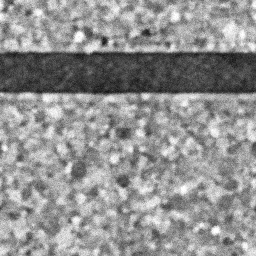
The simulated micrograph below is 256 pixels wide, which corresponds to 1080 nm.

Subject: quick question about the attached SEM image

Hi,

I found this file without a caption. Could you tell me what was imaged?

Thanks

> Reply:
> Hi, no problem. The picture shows one or a few lines or trenches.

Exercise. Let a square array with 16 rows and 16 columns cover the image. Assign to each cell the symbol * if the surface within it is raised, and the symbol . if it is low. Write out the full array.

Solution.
****************
****************
****************
................
................
................
****************
****************
****************
****************
****************
****************
****************
****************
****************
****************